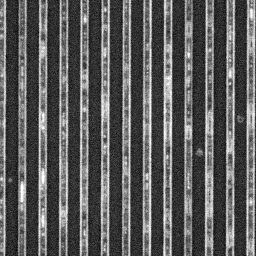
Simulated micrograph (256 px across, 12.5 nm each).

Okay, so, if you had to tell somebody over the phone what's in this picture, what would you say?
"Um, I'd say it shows parallel lines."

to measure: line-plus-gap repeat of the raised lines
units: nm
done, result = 260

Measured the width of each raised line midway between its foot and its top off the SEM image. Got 84.2 nanometers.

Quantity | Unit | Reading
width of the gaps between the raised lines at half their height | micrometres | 0.168